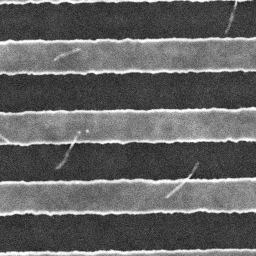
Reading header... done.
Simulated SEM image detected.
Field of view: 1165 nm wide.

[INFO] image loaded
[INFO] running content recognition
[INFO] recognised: lines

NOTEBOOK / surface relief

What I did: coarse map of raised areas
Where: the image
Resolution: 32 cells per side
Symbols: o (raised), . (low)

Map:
o...............................
................................
................................
................................
................................
oooooooooooooooooooooooooooooooo
oooooooooooooooooooooooooooooooo
oooooooooooooooooooooooooooooooo
oooooooooooooooooooooooooooooooo
................................
................................
................................
................................
...............................o
oooooooooooooooooooooooooooooooo
oooooooooooooooooooooooooooooooo
oooooooooooooooooooooooooooooooo
oooooooooooooooooooooooooooooooo
................................
................................
................................
................................
...............o.o....oooooooooo
oooooooooooooooooooooooooooooooo
oooooooooooooooooooooooooooooooo
oooooooooooooooooooooooooooooooo
oooooooooooooooooooooooo..oooooo
................................
................................
................................
................................
.....o...o..oooooooooooooooooooo